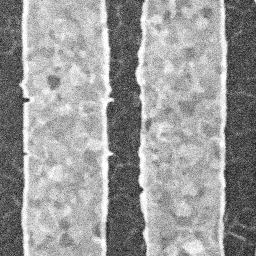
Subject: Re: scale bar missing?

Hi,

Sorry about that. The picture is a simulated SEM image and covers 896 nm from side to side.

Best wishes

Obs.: one or a few lines or trenches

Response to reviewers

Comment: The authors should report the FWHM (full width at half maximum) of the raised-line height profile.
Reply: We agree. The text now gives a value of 281 nanometres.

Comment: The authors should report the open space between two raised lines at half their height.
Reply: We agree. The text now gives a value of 130 nanometres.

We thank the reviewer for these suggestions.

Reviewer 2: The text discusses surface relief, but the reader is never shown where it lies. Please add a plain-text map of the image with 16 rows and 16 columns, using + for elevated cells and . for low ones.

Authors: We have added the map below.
..++++...+++++..
..+++++..+++++..
..+++++..+++++..
..+++++..+++++..
..+++++..+++++..
..+++++..+++++..
..+++++..+++++..
..+++++..+++++..
..+++++..+++++..
..+++++..+++++..
..+++++..+++++..
..+++++..+++++..
..+++++..+++++..
..+++++..+++++..
..++++...+++++..
..++++...+++++..